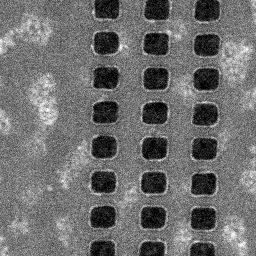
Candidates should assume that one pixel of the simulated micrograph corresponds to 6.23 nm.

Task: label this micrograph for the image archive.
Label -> a regular array of raised bodies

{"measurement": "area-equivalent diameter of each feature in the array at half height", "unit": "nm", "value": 173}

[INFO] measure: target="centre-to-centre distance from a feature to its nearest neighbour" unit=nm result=216